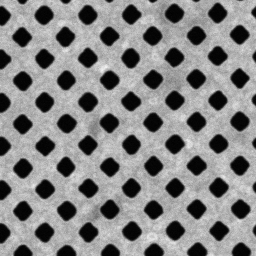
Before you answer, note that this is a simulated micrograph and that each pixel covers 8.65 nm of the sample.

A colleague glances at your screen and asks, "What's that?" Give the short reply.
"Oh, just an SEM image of a regular array of holes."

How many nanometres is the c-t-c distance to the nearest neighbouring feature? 262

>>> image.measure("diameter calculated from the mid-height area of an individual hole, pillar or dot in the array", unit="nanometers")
158